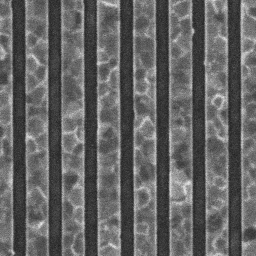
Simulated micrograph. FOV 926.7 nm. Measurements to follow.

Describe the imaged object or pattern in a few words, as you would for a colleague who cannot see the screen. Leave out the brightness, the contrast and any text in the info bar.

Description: parallel lines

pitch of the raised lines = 130 nm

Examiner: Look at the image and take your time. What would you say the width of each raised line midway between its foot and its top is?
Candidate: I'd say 0.0797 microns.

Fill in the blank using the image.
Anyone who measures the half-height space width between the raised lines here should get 49.8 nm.